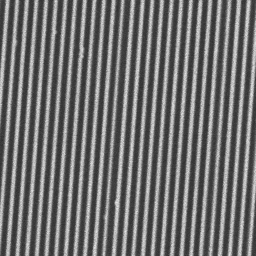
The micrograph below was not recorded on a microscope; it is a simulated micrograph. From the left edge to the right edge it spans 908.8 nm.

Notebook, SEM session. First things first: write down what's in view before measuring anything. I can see parallel lines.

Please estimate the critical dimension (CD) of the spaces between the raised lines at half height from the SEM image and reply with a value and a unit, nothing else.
0.0195 µm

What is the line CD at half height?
13.3 nanometers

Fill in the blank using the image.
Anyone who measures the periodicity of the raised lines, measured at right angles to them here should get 34.2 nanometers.